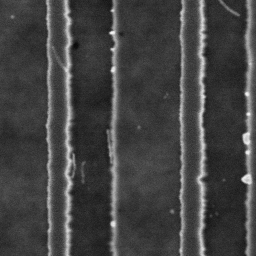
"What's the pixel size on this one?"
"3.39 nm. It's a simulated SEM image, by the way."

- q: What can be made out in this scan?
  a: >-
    lines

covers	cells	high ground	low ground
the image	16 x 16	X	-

XXXX---XXXXXX---
XXXX---XXXXXX---
XXXX---XXXXXX--X
XXXX---XXXXXX---
XXXX---XXXXXX---
XXXX---XXXXXX--X
XXXX---XXXXXX---
XXXX---XXXXXX--X
XXXX---XXXXXX--X
XXXX---XXXXXX--X
XXXX---XXXXXX--X
XXXX---XXXXXX--X
XXXX---XXXXXX--X
XXXX---XXXXXX--X
XXXX---XXXXXX--X
XXXX---XXXXXX--X